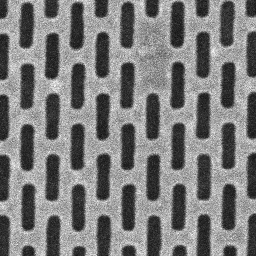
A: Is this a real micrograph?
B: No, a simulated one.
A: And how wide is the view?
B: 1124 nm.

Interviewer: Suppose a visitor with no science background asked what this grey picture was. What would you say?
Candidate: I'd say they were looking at a regular array of holes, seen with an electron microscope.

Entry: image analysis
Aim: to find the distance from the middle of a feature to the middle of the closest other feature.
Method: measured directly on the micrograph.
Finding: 171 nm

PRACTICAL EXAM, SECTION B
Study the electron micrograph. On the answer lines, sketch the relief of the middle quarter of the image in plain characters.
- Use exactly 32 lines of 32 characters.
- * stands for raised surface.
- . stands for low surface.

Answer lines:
**...**....***....*********...**
**...***...***....*********...**
**...***...***....*********...**
**...****.****....*********...**
*....*********....*********...**
**...*********....*********...**
**...*********....*********...**
*....****..***....***..****...**
*....***....**....***...***...**
**...***....**....**....**....**
**...***...***...***....***...**
********...*********....********
********...*********....********
********...*********....********
********...*********....********
**...***....***...**....***...**
**...***....**....**....***....*
**...***....**....**....***....*
**...***...***....***..****....*
**...*********....*********...**
**...*********....*********...**
**...*********....*********...**
*....****..***....****.****...**
*....***....**....***...***...**
*....***....**....***...***...**
**...***....**....**....***...**
**..****....***.****....***..***
********....********....********
********...*********....********
********...*********....********
**...***...****...**....***...**
**....**....**....**....***....*